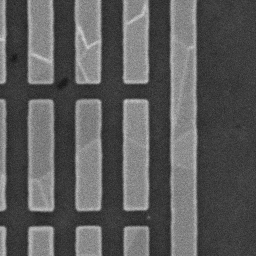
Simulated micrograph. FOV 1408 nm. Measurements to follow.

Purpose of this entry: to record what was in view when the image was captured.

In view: wiring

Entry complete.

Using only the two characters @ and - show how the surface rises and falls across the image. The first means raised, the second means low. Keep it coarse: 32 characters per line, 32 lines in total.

@---@@@--@@@@--@@@---@@@--------
@---@@@--@@@@--@@@---@@@--------
@---@@@--@@@@--@@@---@@@--------
@---@@@---@@@--@@@---@@@--------
@---@@@---@@@---@@---@@@--------
@---@@@---@@@--@@@---@@@--------
@---@@@---@@@---@@---@@@--------
@---@@@---@@@---@@---@@@--------
@---@@@---@@@---@@---@@@--------
@---@@@---@@@--@@@----@@--------
----------------------@@--------
----------------------@@--------
----@@----@@----@@----@@--------
@---@@@---@@@---@@---@@@@-------
@---@@@---@@@---@@---@@@--------
@---@@@---@@@--@@@----@@--------
@---@@@---@@@--@@@----@@@-------
@---@@@---@@@---@@---@@@@-------
@---@@@---@@@--@@@---@@@@-------
@---@@@---@@@--@@@---@@@--------
@---@@@---@@@--@@@----@@--------
@---@@@---@@@--@@@----@@@-------
@---@@@---@@@--@@@---@@@--------
@---@@@---@@@---@@---@@@--------
@---@@@---@@@---@@----@@--------
@---@@@---@@@---@@----@@@-------
----------------------@@@-------
----------------------@@@-------
----@@----@@----@@----@@@-------
@---@@@---@@@---@@----@@@-------
@---@@@---@@@---@@----@@@-------
@---@@@---@@@---@@----@@@-------